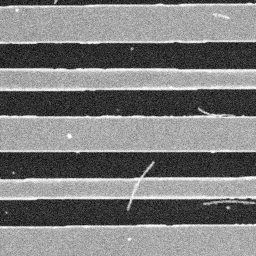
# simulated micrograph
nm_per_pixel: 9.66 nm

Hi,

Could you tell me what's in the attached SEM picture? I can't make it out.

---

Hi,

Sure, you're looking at lines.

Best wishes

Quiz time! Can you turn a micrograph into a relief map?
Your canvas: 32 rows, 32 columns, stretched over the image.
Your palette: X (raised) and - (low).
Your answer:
------------------------------XX
XXXXXXXXXXXXXXXXXXXXXXXXXXXXXXXX
XXXXXXXXXXXXXXXXXXXXXXXXXXXXXXXX
XXXXXXXXXXXXXXXXXXXXXXXXXXXXXXXX
XXXXXXXXXXXXXXXXXXXXXXXXXXXXXXXX
--------------------------------
--------------------------------
--------------------------------
--------------------------------
XXXXXXXXXXXXXXXXXXXXXXXXXXXXXXXX
XXXXXXXXXXXXXXXXXXXXXXXXXXXXXXXX
--------------------------------
--------------------------------
--------------------------------
--------------------------XX----
XXXXXXXXXXXXXXXXXXXXXXXXXXXXXXXX
XXXXXXXXXXXXXXXXXXXXXXXXXXXXXXXX
XXXXXXXXXXXXXXXXXXXXXXXXXXXXXXXX
XXXXXXXXXXXXXXXXXXXXXXXXXXXXXXXX
--------------------------------
--------------------------------
--------------------------------
XXXXXXXXXXXXXXXXXXXXXXXXXXXXXXXX
XXXXXXXXXXXXXXXXXXXXXXXXXXXXXXXX
XXXXXXXXXXXXXXXXXXXXXXXXXXXXXXXX
--------------------------------
--------------------------------
--------------------------------
XXXXXXXXXXXXXXXXXXXXXXXXXXXXXXXX
XXXXXXXXXXXXXXXXXXXXXXXXXXXXXXXX
XXXXXXXXXXXXXXXXXXXXXXXXXXXXXXXX
XXXXXXXXXXXXXXXXXXXXXXXXXXXXXXXX